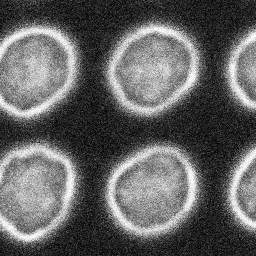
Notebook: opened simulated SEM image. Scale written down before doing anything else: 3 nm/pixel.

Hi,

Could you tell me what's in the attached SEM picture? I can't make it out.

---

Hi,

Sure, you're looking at holes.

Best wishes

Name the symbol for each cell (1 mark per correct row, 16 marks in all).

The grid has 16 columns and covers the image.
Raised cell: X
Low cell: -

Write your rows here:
XXXXXXXXXXXXXXXX
XXXXXXXXXXXXXXXX
X---XXXX---XXXXX
----XXXX----XXX-
----XXX-----XXX-
----XXX----XXXX-
---XXXXX--XXXXXX
XXXXXXXXXXXXXXXX
XXXXXXXXXXXXXXXX
XX-XXXXXXXXXXXXX
----XXXX----XXX-
----XXX-----XXX-
----XXX-----XXX-
----XXXX---XXXX-
X-XXXXXXXXXXXXXX
XXXXXXXXXXXXXXXX